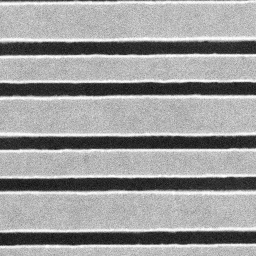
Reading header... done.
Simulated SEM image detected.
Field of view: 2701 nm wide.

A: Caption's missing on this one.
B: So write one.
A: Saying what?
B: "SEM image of lines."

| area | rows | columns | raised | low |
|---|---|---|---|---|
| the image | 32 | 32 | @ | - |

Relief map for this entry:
@@@@@@@@@@@@@@@@@@@@@@@@@@@@@@@@
@@@@@@@@@@@@@@@@@@@@@@@@@@@@@@@@
@@@@@@@@@@@@@@@@@@@@@@@@@@@@@@@@
@@@@@@@@@@@@@@@@@@@@@@@@@@@@@@@@
@@@@@@@@@@@@@@@@@@@@@@@@@@@@@@@@
--------------------------------
--------------------------------
@@@@@@@@@@@@@@@@@@@@@@@@@@@@@@@@
@@@@@@@@@@@@@@@@@@@@@@@@@@@@@@@@
@@@@@@@@@@@@@@@@@@@@@@@@@@@@@@@@
--------------------------------
--------------------------------
@@@@@@@@@@@@@@@@@@@@@@@@@@@@@@@@
@@@@@@@@@@@@@@@@@@@@@@@@@@@@@@@@
@@@@@@@@@@@@@@@@@@@@@@@@@@@@@@@@
@@@@@@@@@@@@@@@@@@@@@@@@@@@@@@@@
@@@@@@@@@@@@@@@@@@@@@@@@@@@@@@@@
--------------------------------
--------------------------------
@@@@@@@@@@@@@@@@@@@@@@@@@@@@@@@@
@@@@@@@@@@@@@@@@@@@@@@@@@@@@@@@@
@@@@@@@@@@@@@@@@@@@@@@@@@@@@@@@@
--------------------------------
--------------------------------
@@@@@@@@@@@@@@@@@@@@@@@@@@@@@@@@
@@@@@@@@@@@@@@@@@@@@@@@@@@@@@@@@
@@@@@@@@@@@@@@@@@@@@@@@@@@@@@@@@
@@@@@@@@@@@@@@@@@@@@@@@@@@@@@@@@
@@@@@@@@@@@@@@@@@@@@@@@@@@@@@@@@
--------------------------------
--------------------------------
@@@@@@@@@@@@@@@@@@@@@@@@@@@@@@@@